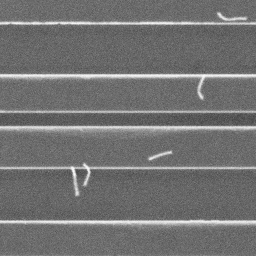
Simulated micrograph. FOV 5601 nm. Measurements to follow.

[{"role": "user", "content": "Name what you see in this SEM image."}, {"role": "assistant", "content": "lines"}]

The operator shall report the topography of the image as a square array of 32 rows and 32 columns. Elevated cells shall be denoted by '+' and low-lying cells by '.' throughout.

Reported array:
++++++++++++++++++++++++++++++++
++++++++++++++++++++++++++++++++
++++++++++++++++++++++++++++++++
................................
................................
................................
................................
................................
................................
+++..+++++++++++++++++++++++++++
++++++++++++++++++++++++++++++++
++++++++++++++++++++++++++++++++
++++++++++++++++++++++++++++++++
++++++++++++++++++++++++++++++++
................................
................................
++++++++++++++++++++++++++++++++
++++++++++++++++++++++++++++++++
++++++++++++++++++++++++++++++++
++++++++++++++++++++++++++++++++
++++++++++++++++++++++++++++++++
................................
................................
................................
................................
................................
................................
................................
++++++++++++++++++++++++++++++++
++++++++++++++++++++++++++++++++
++++++++++++++++++++++++++++++++
++++++++++++++++++++++++++++++++